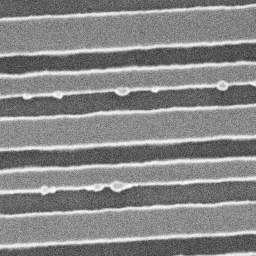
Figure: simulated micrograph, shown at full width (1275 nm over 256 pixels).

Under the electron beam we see lines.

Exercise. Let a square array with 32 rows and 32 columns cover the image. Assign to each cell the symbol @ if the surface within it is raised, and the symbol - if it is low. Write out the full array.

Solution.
--------------------------------
----------------@@@@@@@@@@@@@@@@
@@@@@@@@@@@@@@@@@@@@@@@@@@@@@@@@
@@@@@@@@@@@@@@@@@@@@@@@@@@@@@@@@
@@@@@@@@@@@@@@@@@@@@@@@@@@@@@@@@
@@@@@@@@@@@@@@@@@@@@@@@@@@@-----
@@@@@@@@@-----------------------
--------------------------------
----------------@-@@@@@@@@@@@@@@
---@@@@@@@@@@@@@@@@@@@@@@@@@@@@@
@@@@@@@@@@@@@@@@@@@@@@@@@@@@@@@@
@@@@@@@@@@@@--@@----------------
--------------------------------
------------------------@@@@@@@@
-------@@@@@@@@@@@@@@@@@@@@@@@@@
@@@@@@@@@@@@@@@@@@@@@@@@@@@@@@@@
@@@@@@@@@@@@@@@@@@@@@@@@@@@@@@@@
@@@@@@@@@@@@@@@@@@@@@@@@@-------
@@@@@@--------------------------
--------------------------------
------------------@@@@@@@@@@@@@@
@@@@@@@@@@@@@@@@@@@@@@@@@@@@@@@@
@@@@@@@@@@@@@@@@@@@@@@@@@@@@@---
@@@@@@@@@@@@@-@@----------------
--------------------------------
---------------------------@@@@@
---------@@@@@@@@@@@@@@@@@@@@@@@
@@@@@@@@@@@@@@@@@@@@@@@@@@@@@@@@
@@@@@@@@@@@@@@@@@@@@@@@@@@@@@@@@
@@@@@@@@@@@@@@@@@@@@@@----------
@@@@@@@-------------------------
--------------------------------